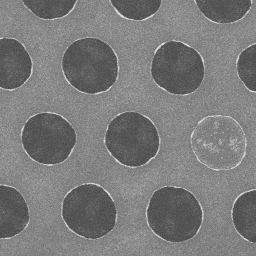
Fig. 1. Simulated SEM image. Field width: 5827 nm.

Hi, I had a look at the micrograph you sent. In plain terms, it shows holes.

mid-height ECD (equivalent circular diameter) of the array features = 1240 nm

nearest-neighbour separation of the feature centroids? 1910 nanometres